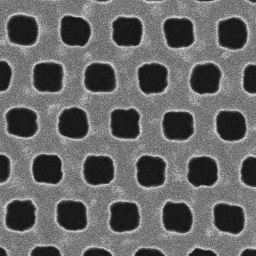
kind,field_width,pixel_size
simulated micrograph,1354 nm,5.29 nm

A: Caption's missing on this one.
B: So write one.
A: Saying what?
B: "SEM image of a regular array of holes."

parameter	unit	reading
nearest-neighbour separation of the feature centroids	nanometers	273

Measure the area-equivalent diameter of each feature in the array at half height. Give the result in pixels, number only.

30.6